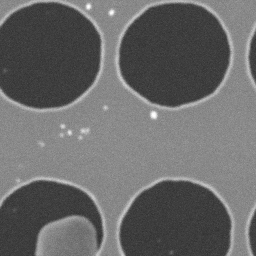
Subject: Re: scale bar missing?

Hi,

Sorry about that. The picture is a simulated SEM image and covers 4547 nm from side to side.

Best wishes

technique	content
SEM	holes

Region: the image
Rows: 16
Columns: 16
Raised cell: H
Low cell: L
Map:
HLLLLHHHHLLLLHHH
LLLLLLHHLLLLLLHH
LLLLLLHHLLLLLLHH
LLLLLLHLLLLLLLHH
LLLLLLHLLLLLLLHH
LLLLLLHHLLLLLLHH
HLLLHHHHHHLLHHHH
HHHHHHHHHHHHHHHH
HHHHHHHHHHHHHHHH
HHHHHHHHHHHHHHHH
HHHHHHHHHHHHHHHH
HHLLHHHHHHLLHHHH
LLLLLLHHLLLLLLHH
LLLLLLHHLLLLLLHH
LLLLLLHLLLLLLLHH
LLLLLLHHLLLLLLHH